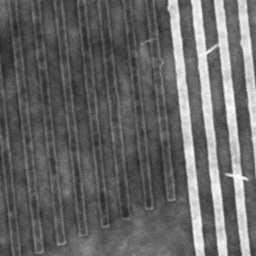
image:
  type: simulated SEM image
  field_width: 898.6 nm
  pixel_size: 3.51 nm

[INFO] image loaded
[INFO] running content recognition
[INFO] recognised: parallel lines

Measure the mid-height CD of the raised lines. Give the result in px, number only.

7.58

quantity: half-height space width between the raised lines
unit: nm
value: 53.2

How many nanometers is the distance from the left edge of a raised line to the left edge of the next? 80.1